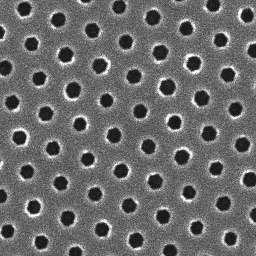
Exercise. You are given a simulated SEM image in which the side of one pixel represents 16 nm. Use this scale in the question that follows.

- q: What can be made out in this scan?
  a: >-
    a regular array of holes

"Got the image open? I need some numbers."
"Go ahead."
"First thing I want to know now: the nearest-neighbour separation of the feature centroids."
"565 nm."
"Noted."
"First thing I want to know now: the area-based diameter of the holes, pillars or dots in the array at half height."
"242 nm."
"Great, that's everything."